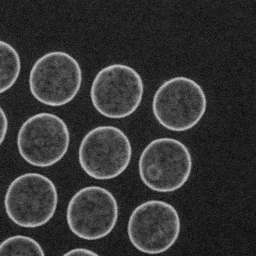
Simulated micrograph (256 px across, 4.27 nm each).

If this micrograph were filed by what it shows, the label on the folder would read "a regular array of raised bodies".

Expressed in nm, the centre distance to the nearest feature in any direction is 263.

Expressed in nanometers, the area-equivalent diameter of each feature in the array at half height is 221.